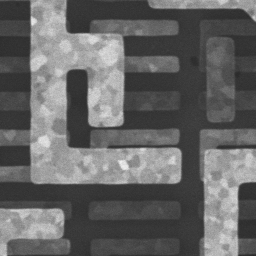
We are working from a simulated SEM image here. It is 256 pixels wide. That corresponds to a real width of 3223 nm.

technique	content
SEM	wiring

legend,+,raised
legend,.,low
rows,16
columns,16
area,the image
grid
..++...........+
..++............
..++++++.....+..
..++++++.....++.
..++.+++.....++.
..++..++.....++.
..++..++.....++.
..++..++.....+..
..++............
..+++++++++..+++
..+++++++++..+++
......++.....++.
.............++.
++++.........++.
++++.........++.
.............++.